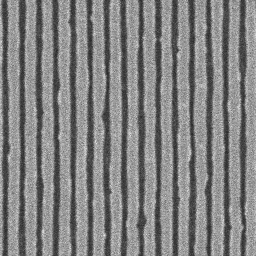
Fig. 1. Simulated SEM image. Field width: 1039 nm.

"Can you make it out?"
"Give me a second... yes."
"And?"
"parallel lines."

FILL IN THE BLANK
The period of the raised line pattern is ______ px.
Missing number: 17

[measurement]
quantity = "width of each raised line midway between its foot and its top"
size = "45.2 nanometres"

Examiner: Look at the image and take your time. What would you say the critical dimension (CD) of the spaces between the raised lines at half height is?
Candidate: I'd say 22.9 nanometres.